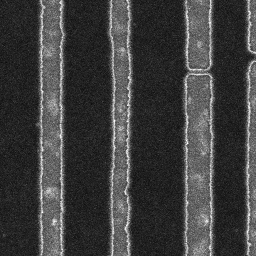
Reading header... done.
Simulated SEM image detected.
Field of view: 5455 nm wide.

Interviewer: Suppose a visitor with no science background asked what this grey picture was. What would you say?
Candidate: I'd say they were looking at one or a few lines or trenches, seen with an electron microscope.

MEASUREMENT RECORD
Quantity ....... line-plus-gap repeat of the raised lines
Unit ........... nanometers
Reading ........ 1520